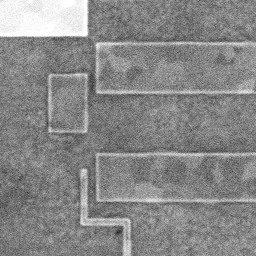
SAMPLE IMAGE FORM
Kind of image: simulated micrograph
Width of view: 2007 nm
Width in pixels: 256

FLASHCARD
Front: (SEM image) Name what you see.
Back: wiring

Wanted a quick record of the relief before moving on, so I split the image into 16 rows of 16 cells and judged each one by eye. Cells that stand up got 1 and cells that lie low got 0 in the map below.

1111100000000000
1111100000000000
0000000000000000
0000001111111111
0000001111111111
0001101111111111
0001100000000000
0001100000000000
0000000000000000
0000000000000000
0000001111111111
0000001111111111
0000001111111111
0000010000000000
0000000000000000
0000000000000000